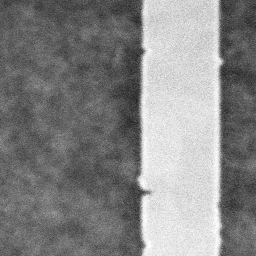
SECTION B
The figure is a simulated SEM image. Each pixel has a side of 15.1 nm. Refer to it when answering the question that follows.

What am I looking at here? one or a few lines or trenches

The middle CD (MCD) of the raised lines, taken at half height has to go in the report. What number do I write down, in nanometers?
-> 1110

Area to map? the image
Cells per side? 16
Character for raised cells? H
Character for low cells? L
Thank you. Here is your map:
LLLLLLLLLHHHHHLL
LLLLLLLLLHHHHHLL
LLLLLLLLLHHHHHLL
LLLLLLLLLHHHHHLL
LLLLLLLLLHHHHHLL
LLLLLLLLLHHHHHLL
LLLLLLLLLHHHHHLL
LLLLLLLLLHHHHHLL
LLLLLLLLLHHHHHLL
LLLLLLLLLHHHHHLL
LLLLLLLLLHHHHHLL
LLLLLLLLLHHHHHLL
LLLLLLLLLHHHHHLL
LLLLLLLLLHHHHHLL
LLLLLLLLLHHHHHLL
LLLLLLLLLHHHHHLL